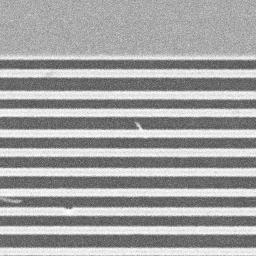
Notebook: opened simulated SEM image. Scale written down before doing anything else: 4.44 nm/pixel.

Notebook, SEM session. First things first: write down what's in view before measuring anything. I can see parallel lines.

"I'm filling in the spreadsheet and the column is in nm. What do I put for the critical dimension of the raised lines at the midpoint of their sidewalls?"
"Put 31.1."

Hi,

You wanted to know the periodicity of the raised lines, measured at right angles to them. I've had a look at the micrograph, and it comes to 88 nanometers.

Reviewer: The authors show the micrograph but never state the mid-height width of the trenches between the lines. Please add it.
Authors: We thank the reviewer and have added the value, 53.2 nm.